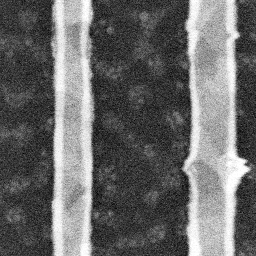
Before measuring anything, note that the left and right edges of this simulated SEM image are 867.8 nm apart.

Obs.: one or a few lines or trenches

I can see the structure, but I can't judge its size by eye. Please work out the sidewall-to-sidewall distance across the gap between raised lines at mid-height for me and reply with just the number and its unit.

0.369 microns